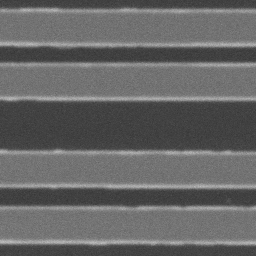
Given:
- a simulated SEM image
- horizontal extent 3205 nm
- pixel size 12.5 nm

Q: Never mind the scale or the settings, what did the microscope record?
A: lines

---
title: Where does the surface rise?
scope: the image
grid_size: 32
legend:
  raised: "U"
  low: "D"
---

DDDDDDDDDDDDDDDDDDDDDDDDDDDDDDDD
UUUUUUUUUUUUUUUUUUUUUUUUUUUUUUUU
UUUUUUUUUUUUUUUUUUUUUUUUUUUUUUUU
UUUUUUUUUUUUUUUUUUUUUUUUUUUUUUUU
UUUUUUUUUUUUUUUUUUUUUUUUUUUUUUUU
UUUUUUUUUUUUUUUUUUUUUUUUUUUUUUUU
DDDDDDDDDDDDDDDDDDDDDDDDDDDDDDDD
DDDDDDDDDDDDDDDDDDDDDDDDDDDDDDDD
UUUUUUUUUUUUUUUUUUUUUUUUUUUUUUUU
UUUUUUUUUUUUUUUUUUUUUUUUUUUUUUUU
UUUUUUUUUUUUUUUUUUUUUUUUUUUUUUUU
UUUUUUUUUUUUUUUUUUUUUUUUUUUUUUUU
DDDDDDDDDDDDDDDDDDDDDDDDDDDDDDDD
DDDDDDDDDDDDDDDDDDDDDDDDDDDDDDDD
DDDDDDDDDDDDDDDDDDDDDDDDDDDDDDDD
DDDDDDDDDDDDDDDDDDDDDDDDDDDDDDDD
DDDDDDDDDDDDDDDDDDDDDDDDDDDDDDDD
DDDDDDDDDDDDDDDDDDDDDDDDDDDDDDDD
DDDDDDDDDDDDDDDDDDDDDDDDDDDDDDDD
UUUUUUUUUUUUUUUUUUUUUUUUUUUUUUUU
UUUUUUUUUUUUUUUUUUUUUUUUUUUUUUUU
UUUUUUUUUUUUUUUUUUUUUUUUUUUUUUUU
UUUUUUUUUUUUUUUUUUUUUUUUUUUUUUUU
DDDDDDDDDDDDDDDDDDDDDDDDDDDDDDDD
DDDDDDDDDDDDDDDDDDDDDDDDDDDDDDDD
DDDDDDDDDDDDDDDDDDDDDDDDDDDDDDDD
UUUUUUUUUUUUUUUUUUUUUUUUUUUUUUUU
UUUUUUUUUUUUUUUUUUUUUUUUUUUUUUUU
UUUUUUUUUUUUUUUUUUUUUUUUUUUUUUUU
UUUUUUUUUUUUUUUUUUUUUUUUUUUUUUUU
DDDDDDDDDDDDDDDDDDDDDDDDDDDDDDDD
DDDDDDDDDDDDDDDDDDDDDDDDDDDDDDDD